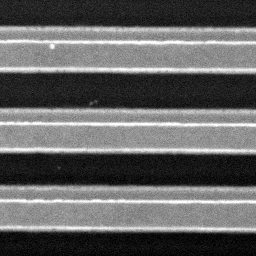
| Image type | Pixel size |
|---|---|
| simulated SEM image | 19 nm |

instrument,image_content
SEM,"lines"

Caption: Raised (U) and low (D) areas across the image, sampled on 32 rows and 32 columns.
DDDDDDDDDDDDDDDDDDDDDDDDDDDDDDDD
DDDDDDDDDDDDDDDDDDDDDDDDDDDDDDDD
DDDDDDDDDDDDDDDDDDDDDDDDDDDDDDDD
DDDDDDDDDDDDDDDDDDDDDDDDDDDDDDDD
UUUUUUUUUUUUUUUUUUUUUUUUUUUUUUUU
UUUUUUUUUUUUUUUUUUUUUUUUUUUUUUUU
UUUUUUUUUUUUUUUUUUUUUUUUUUUUUUUU
UUUUUUUUUUUUUUUUUUUUUUUUUUUUUUUU
UUUUUUUUUUUUUUUUUUUUUUUUUUUUUUUU
DDDDDDDDDDDDDDDDDDDDDDDDDDDDDDDD
DDDDDDDDDDDDDDDDDDDDDDDDDDDDDDDD
DDDDDDDDDDDDDDDDDDDDDDDDDDDDDDDD
DDDDDDDDDDDDDDDDDDDDDDDDDDDDDDDD
DDDDDDDDDDDDDDDDDDDDDDDDDDDDDDDD
UUUUUUUUUUUUUUUUUUUUUUUUUUUUUUUU
UUUUUUUUUUUUUUUUUUUUUUUUUUUUUUUU
UUUUUUUUUUUUUUUUUUUUUUUUUUUUUUUU
UUUUUUUUUUUUUUUUUUUUUUUUUUUUUUUU
UUUUUUUUUUUUUUUUUUUUUUUUUUUUUUUU
DDDDDDDDDDDDDDDDDDDDDDDDDDDDDDDD
DDDDDDDDDDDDDDDDDDDDDDDDDDDDDDDD
DDDDDDDDDDDDDDDDDDDDDDDDDDDDDDDD
DDDDDDDDDDDDDDDDDDDDDDDDDDDDDDDD
DDDDDDDDDDDDDDDDDDDDDDDDDDDDDDDD
UUUUUUUUUUUUUUUUUUUUUUUUUUUUUUUU
UUUUUUUUUUUUUUUUUUUUUUUUUUUUUUUU
UUUUUUUUUUUUUUUUUUUUUUUUUUUUUUUU
UUUUUUUUUUUUUUUUUUUUUUUUUUUUUUUU
DDDUUDUUUUUUUUUUUUUUUUUUUUUUUUUU
DDDDDDDDDDDDDDDDDDDDDDDDDDDDDDDD
DDDDDDDDDDDDDDDDDDDDDDDDDDDDDDDD
DDDDDDDDDDDDDDDDDDDDDDDDDDDDDDDD